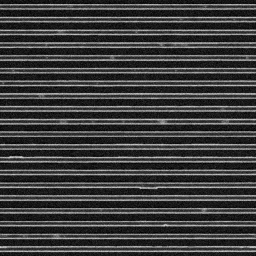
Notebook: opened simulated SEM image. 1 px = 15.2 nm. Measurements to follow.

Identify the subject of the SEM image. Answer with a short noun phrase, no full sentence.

parallel lines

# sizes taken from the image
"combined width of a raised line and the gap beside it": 193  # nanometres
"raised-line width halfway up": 70.1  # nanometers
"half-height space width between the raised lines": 125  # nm